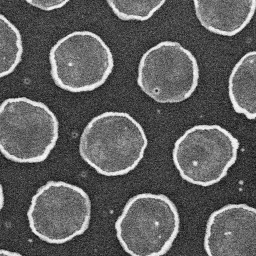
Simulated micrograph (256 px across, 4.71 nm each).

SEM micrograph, raised bodies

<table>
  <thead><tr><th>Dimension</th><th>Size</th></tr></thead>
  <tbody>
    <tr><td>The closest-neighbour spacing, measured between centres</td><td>0.414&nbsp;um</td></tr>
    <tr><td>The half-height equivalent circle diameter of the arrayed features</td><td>0.289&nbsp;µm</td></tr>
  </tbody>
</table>